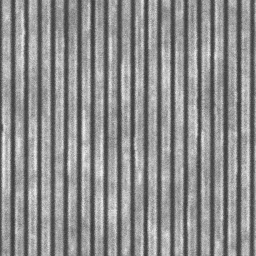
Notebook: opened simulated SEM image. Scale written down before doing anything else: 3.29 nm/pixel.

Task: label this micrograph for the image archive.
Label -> parallel lines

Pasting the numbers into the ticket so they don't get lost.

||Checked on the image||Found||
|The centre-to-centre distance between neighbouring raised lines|43.8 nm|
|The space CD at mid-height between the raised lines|16.5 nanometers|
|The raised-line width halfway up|25.9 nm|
